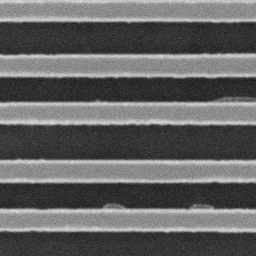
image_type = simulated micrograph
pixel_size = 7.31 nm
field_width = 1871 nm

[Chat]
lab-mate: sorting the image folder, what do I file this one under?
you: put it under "lines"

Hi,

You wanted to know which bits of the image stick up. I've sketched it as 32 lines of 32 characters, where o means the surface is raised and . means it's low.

oooooooooooooooooooooooooooooooo
oooooooooooooooooooooooooooooooo
oooooooooooooooooooooooooooooooo
................................
................................
................................
................................
oooooooooooooooooooooooooooooooo
oooooooooooooooooooooooooooooooo
oooooooooooooooooooooooooooooooo
................................
................................
................................
oooooooooooooooooooooooooooooooo
oooooooooooooooooooooooooooooooo
o..ooooooooooooo.oo.oooooooooooo
................................
................................
................................
................................
oooooooooooooooooooooooooooooooo
oooooooooooooooooooooooooooooooo
oooooooooooooooooooooooooooooooo
................................
................................
................................
oooooooooooooooooooooooooooooooo
oooooooooooooooooooooooooooooooo
oooooooooooooooooooooooooooooooo
................................
................................
................................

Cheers